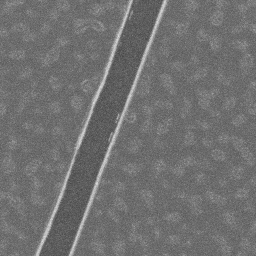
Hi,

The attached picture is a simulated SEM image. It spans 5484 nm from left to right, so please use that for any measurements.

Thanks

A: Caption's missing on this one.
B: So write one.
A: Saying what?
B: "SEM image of one or a few lines or trenches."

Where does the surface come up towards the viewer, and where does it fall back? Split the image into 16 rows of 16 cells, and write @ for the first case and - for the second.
@@@@@@@@--@@@@@@
@@@@@@@@--@@@@@@
@@@@@@@--@@@@@@@
@@@@@@@--@@@@@@@
@@@@@@@--@@@@@@@
@@@@@@--@@@@@@@@
@@@@@@--@@@@@@@@
@@@@@@--@@@@@@@@
@@@@@--@@@@@@@@@
@@@@@--@@@@@@@@@
@@@@--@@@@@@@@@@
@@@@--@@@@@@@@@@
@@@@--@@@@@@@@@@
@@@--@@@@@@@@@@@
@@@--@@@@@@@@@@@
@@@--@@@@@@@@@@@